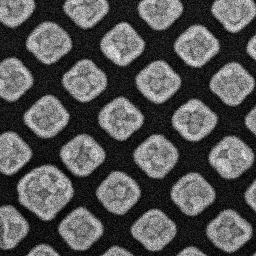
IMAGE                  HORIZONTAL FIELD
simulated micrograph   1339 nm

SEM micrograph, a regular array of raised bodies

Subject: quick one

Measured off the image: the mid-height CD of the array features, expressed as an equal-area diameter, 202 nm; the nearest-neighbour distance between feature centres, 273 nm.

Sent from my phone